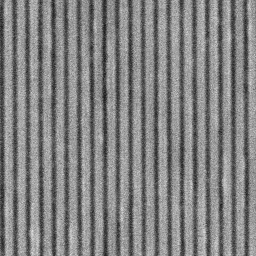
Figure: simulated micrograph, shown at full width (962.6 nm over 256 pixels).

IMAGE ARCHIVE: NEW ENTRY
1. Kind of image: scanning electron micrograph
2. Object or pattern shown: parallel lines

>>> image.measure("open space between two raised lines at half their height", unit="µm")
0.0226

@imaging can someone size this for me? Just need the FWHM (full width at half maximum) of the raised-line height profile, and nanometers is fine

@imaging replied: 25.9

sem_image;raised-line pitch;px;12.8